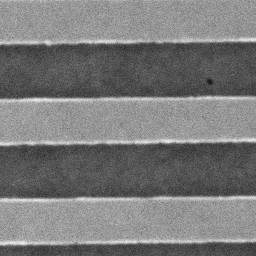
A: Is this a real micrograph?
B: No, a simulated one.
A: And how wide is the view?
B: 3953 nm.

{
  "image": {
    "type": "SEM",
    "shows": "lines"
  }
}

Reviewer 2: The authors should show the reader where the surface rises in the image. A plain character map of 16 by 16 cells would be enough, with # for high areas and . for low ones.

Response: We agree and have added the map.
################
################
###############.
................
................
................
################
################
################
................
................
................
################
################
################
................